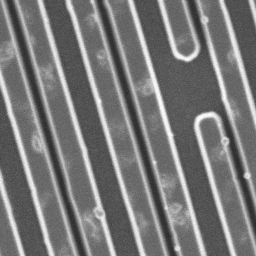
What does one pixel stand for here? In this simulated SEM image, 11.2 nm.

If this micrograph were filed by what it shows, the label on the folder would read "parallel lines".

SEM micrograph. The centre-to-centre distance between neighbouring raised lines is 487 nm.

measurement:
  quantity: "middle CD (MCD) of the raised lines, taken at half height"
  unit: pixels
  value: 23.9